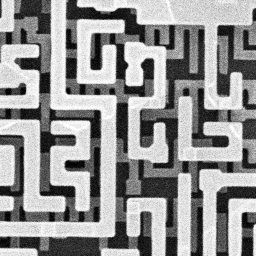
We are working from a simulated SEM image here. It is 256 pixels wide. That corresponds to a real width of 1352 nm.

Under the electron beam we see wiring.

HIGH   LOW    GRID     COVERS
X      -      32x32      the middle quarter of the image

---XXX----XXX---XXX----XX-------
---XXXX--XXXX---XXXX---XX-------
---XXXXXXXXXX---XXXX---XX-------
---XXXXXXXXXX---XXXX---XX-------
----XXXXXXXXX---XXXX---XX-------
-----------------------XX-------
-----------------------XX-------
X----------------------XX-------
XXXXXXXXXXXXX----XXXXXXXX----XXX
XXXXXXXXXXXXX---XXXXXXXXX----XXX
XXXXXXXXXXXXX---XXXXXXXXX----XXX
---------XXXX---XXX----------XXX
----------XXX---XXX----------XXX
----------XXX---XXX----------XXX
XXXXXX----XXX---XXX----------XXX
XXXXXX---XXXX---XXX----XX----XXX
XXXXXX---XXXX---XXX----XX----XXX
XXXXXX---XXXX---XXX----XX----XXX
---XXX---XXXX---XXX----XX----XXX
---XXX---XXXX---XXX----XX----XXX
--XXXX---XXXX---XXX---XXXX---XXX
XXXXXX---XXXX---XXXXXXXXXX---XXX
XXXXXX---XXXX---XXXXXXXXXX---XXX
XXXXXX---XXXX---XXXXXXXXXX---XXX
---------XXXX---------XXXX------
---------XXXX-------------------
---------XXXX-------------------
XXXXXX---XXXX-------------------
XXXXXX---XXXX----------------XX-
XXXXXX---XXXX----------------XXX
---XXX---XXXX----------------XXX
---XXX---XXXX----------------XXX